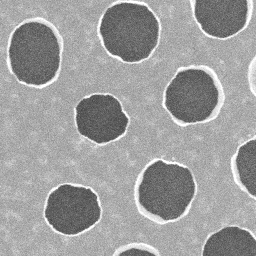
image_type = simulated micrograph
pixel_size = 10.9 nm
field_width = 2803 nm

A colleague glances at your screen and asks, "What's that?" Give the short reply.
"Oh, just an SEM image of holes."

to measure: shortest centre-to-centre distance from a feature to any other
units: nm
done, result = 1010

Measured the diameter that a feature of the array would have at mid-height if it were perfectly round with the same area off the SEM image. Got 615 nm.